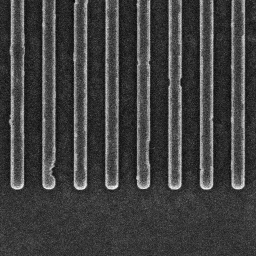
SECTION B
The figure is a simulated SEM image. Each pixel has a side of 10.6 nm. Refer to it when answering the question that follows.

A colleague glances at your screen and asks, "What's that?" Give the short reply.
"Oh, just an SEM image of parallel lines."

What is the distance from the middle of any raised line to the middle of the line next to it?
31.5 px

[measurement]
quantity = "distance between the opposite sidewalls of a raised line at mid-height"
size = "0.134 um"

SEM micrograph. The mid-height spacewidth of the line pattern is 206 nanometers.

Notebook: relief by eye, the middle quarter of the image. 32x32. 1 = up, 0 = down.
00011100000110000001100000011000
00011100000110000001100000111000
00011100000110000001100000111000
00011100000110000001100000111000
00011100000110000001100000011000
00011100000110000001100000111000
00011100001110000001100000111000
00111100000110000001100000111000
00011100000110000011100000111000
00011100000111000011100000111000
00011100000110000011100000111000
00011100000110000011100000111000
00011100000110000011100000111000
00011100000110000011100000111000
00011100000110000011100000111000
00011100000110000011100000111000
00011100000110000011100000111000
00011000000110000011100000111000
00011000000110000011100000111000
00011000000110000011100000111000
00011000000110000011100000111000
00011000000110000011100000111000
00011000000110000011100000111000
00011000000110000011100000111000
00011000000110000011100000111000
00011000000110000011100000111000
00011000000110000011100000111000
00011000000110000011100000111000
00011000000110000011100000111000
00011100000110000011100000111000
00011000000110000001100000111000
00000000000000000000000000000000